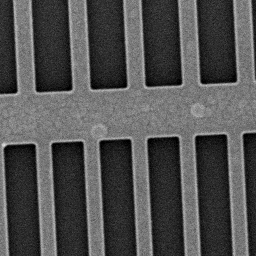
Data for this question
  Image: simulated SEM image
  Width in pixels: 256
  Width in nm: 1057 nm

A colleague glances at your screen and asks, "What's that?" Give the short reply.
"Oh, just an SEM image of groups of lines, slits or small figures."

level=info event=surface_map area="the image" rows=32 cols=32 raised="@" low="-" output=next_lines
--@@-----@@-----@@----@@-----@@-
--@@-----@@-----@@----@@@----@@-
--@@-----@@-----@@----@@@----@@-
--@@-----@@-----@@----@@@----@@-
--@@-----@@-----@@-----@@----@@-
--@@-----@@-----@@-----@@-----@@
--@@-----@@-----@@-----@@-----@@
--@@-----@@-----@@-----@@-----@@
--@@-----@@-----@@-----@@-----@@
--@@-----@@-----@@-----@@-----@@
--@@-----@@-----@@-----@@----@@@
--@@@--@@@@@@@@@@@@@@@@@@@@@@@@@
@@@@@@@@@@@@@@@@@@@@@@@@@@@@@@@@
@@@@@@@@@@@@@@@@@@@@@@@@@@@@@@@@
@@@@@@@@@@@@@@@@@@@@@@@@@@@@@@@@
@@@@@@@@@@@@@@@@@@@@@@@@@@@@@@@@
@@@@@@@@@@@@@@@@@@@@@@@@@@@@@@@@
@@@@@@@@@@@@@---@@----@@----@@--
-----@-----@----@@-----@-----@--
-----@-----@-----@-----@-----@--
-----@-----@-----@-----@-----@--
-----@@----@@----@@----@@----@@-
@----@@----@@----@@----@@----@@-
@----@@----@@----@@----@@----@@-
@----@@----@@----@@----@@----@@-
@----@@----@@----@@----@@----@@-
@----@@----@@----@@----@@----@@-
@----@@----@@----@@----@@----@@-
@----@@----@@----@@----@@----@@-
@----@@----@@----@@----@@----@@-
@----@@----@@----@@----@@----@@-
@----@@----@@----@@----@@----@@-